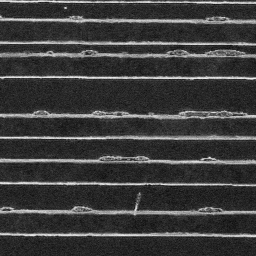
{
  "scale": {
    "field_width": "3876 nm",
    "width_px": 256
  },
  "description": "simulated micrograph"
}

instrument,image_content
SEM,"lines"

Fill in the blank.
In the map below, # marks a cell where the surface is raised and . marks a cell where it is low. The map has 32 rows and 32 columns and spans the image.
................................
................................
................................
################################
################################
......................##########
......................#....##...
################################
################################
################################
................................
................................
................................
................................
#############..##......######...
################################
################################
................................
................................
................................
################################
################################
################################
................................
................................
................................
######...##.....#...............
################################
################################
................................
................................
................................